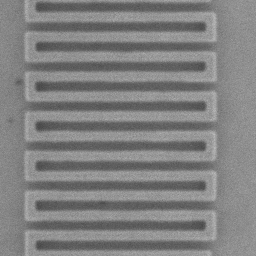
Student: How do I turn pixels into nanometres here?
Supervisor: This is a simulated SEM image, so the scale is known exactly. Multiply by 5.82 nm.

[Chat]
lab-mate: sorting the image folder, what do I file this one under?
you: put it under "groups of lines, slits or small figures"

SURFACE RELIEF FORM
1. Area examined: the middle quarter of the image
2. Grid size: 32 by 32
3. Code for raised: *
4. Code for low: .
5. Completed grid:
................................
................................
********************************
********************************
................................
................................
................................
********************************
********************************
................................
................................
................................
********************************
********************************
................................
................................
................................
********************************
********************************
................................
................................
................................
********************************
********************************
................................
................................
................................
********************************
********************************
................................
................................
................................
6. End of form